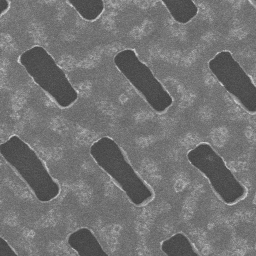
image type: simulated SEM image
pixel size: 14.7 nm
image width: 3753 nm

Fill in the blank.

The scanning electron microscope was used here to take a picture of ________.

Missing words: holes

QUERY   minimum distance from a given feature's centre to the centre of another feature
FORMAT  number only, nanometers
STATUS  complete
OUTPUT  1370